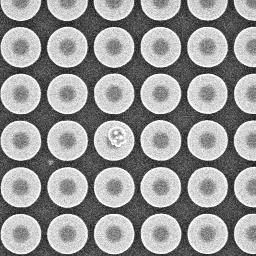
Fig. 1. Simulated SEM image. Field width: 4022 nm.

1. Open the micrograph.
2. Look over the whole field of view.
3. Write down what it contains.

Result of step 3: an array of small figures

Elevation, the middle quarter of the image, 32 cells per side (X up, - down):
XXX--------XXX---------XXX------
--------------------------------
--------------------------------
XXXX-----XXXXXXX-----XXXXXX-----
XXXXX----XXXXXXX----XXXXXXXX----
XXXXX---XXXXXXXXX---XXXXXXXXX--X
XXXXXX--XXXXXXXXX--XXXXXXXXXX--X
XXXXXX--XXXXXXXXX--XXXXXXXXXX--X
XXXXXX--XXXXXXXXX--XXXXXXXXXX--X
XXXXX---XXXXXXXXX---XXXXXXXXX--X
XXXXX----XXXXXXX----XXXXXXXX----
XXXX-----XXXXXX------XXXXXX-----
--------------------------------
--------------------------------
XXX--------XXX--------XXXX------
XXXX-----XXXXXXX-----XXXXXXX----
XXXXX---XXXXXXXXX---XXXXXXXX----
XXXXXX--XXXXXXXXX--XXXXXXXXXX--X
XXXXXX--XXXXXXXXX--XXXXXXXXXX--X
XXXXXX--XXXXXXXXX--XXXXXXXXXX--X
XXXXXX--XXXXXXXXX--XXXXXXXXXX--X
XXXXX---XXXXXXXXX---XXXXXXXXX--X
XXXXX----XXXXXXX----XXXXXXXX----
XXX-------XXXXX-------XXXXX-----
--------------------------------
--------------------------------
XXX-------XXXXX-------XXXXX-----
XXXXX----XXXXXXX----XXXXXXXX----
XXXXX---XXXXXXXXX---XXXXXXXXX---
XXXXXX--XXXXXXXXX--XXXXXXXXXX--X
XXXXXX--XXXXXXXXXX-XXXXXXXXXX--X
XXXXXX--XXXXXXXXXX-XXXXXXXXXX--X